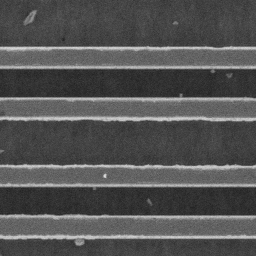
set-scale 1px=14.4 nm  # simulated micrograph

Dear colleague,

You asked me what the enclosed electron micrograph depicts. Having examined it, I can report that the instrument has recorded lines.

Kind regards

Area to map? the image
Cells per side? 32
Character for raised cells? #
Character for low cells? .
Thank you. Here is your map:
................................
................................
................................
................................
................................
................................
################################
################################
.........#.......#.##.##.#.#.###
................................
................................
................................
################################
################################
################################
................................
................................
................................
................................
................................
................................
################################
################################
................................
................................
................................
................................
################################
################################
################################
................................
................................